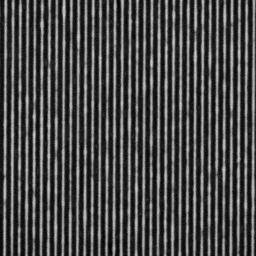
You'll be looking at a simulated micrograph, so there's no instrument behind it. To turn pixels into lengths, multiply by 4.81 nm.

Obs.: parallel lines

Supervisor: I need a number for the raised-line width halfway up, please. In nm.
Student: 9.6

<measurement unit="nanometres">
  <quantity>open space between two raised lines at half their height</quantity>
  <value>23.5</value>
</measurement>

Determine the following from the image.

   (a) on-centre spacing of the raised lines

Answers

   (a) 35.1 nanometres